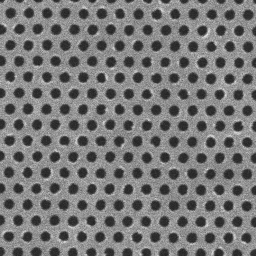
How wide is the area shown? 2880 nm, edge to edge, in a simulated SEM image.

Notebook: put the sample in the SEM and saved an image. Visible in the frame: a regular array of holes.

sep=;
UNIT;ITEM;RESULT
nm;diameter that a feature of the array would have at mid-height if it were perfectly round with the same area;122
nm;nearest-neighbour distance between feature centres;200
